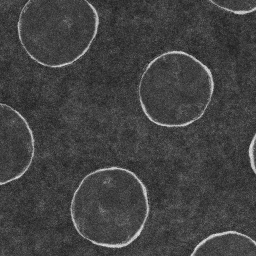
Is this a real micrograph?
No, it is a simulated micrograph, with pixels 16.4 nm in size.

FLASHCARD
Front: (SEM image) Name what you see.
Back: raised bodies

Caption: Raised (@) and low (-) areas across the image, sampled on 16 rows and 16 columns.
-@@@@@--------@@
-@@@@@----------
-@@@@@----------
--@@@-----@@----
---------@@@@---
---------@@@@---
---------@@@@---
@---------@@----
@@--------------
@@--------------
@@--------------
-----@@@@-------
-----@@@@-------
-----@@@@-------
-----@@@@-------
------------@@@@